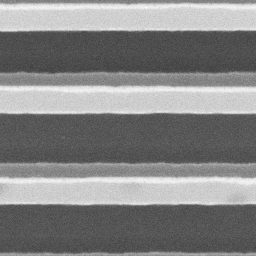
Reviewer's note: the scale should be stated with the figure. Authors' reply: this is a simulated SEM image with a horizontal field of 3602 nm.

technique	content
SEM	lines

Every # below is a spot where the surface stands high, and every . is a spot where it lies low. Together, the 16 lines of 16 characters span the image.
################
################
................
................
................
################
################
................
................
................
################
################
################
................
................
................